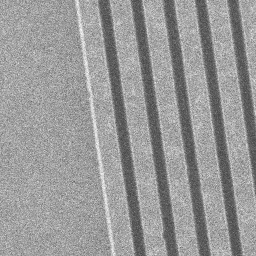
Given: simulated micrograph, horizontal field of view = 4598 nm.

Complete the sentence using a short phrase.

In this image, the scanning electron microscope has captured parallel lines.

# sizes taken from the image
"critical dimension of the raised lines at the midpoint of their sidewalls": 380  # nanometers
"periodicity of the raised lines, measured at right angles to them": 574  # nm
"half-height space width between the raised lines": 0.191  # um